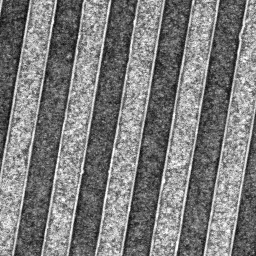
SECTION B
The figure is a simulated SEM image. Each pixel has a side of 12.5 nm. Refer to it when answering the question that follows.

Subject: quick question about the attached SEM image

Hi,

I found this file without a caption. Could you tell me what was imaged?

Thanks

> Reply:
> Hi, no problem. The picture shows parallel lines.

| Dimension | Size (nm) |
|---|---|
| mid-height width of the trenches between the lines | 346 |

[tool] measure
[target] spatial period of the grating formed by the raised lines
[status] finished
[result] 668 nm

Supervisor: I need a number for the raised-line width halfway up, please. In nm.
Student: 321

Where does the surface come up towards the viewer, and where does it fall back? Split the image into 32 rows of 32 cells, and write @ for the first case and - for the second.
----@@@---@@@@---@@@----@@@----@
----@@@---@@@@---@@@----@@@----@
---@@@@---@@@----@@@----@@@----@
---@@@----@@@----@@@----@@@---@@
---@@@----@@@----@@@---@@@@---@@
---@@@----@@@---@@@@---@@@----@@
---@@@---@@@@---@@@----@@@----@@
---@@@---@@@@---@@@----@@@----@@
--@@@@---@@@----@@@----@@@---@@@
--@@@----@@@----@@@---@@@@---@@@
--@@@----@@@----@@@---@@@@---@@@
--@@@----@@@---@@@@---@@@----@@@
--@@@----@@@---@@@@---@@@----@@@
--@@@---@@@@---@@@----@@@----@@@
-@@@@---@@@----@@@----@@@---@@@@
-@@@----@@@----@@@---@@@@---@@@@
-@@@----@@@----@@@---@@@@---@@@-
-@@@----@@@---@@@@---@@@----@@@-
-@@@---@@@@---@@@----@@@----@@@-
-@@@---@@@@---@@@----@@@----@@@-
@@@@---@@@----@@@----@@@---@@@@-
@@@----@@@----@@@---@@@@---@@@@-
@@@----@@@----@@@---@@@@---@@@--
@@@----@@@---@@@@---@@@----@@@--
@@@---@@@@---@@@----@@@----@@@--
@@@---@@@----@@@----@@@----@@@--
@@@---@@@----@@@----@@@---@@@@--
@@----@@@----@@@---@@@@---@@@@--
@@----@@@----@@@---@@@@---@@@---
@@----@@@---@@@@---@@@----@@@---
@@---@@@@---@@@----@@@----@@@---
@@---@@@----@@@----@@@----@@@---